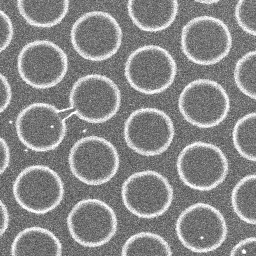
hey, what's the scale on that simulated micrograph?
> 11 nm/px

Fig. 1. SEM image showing a regular array of raised bodies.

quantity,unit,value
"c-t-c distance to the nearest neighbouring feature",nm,680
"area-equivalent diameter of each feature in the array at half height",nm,502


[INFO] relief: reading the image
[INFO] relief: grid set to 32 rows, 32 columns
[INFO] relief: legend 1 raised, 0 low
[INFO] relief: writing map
00111111000000001111110000000011
00011111000000001111110000000011
10001110001111000111100001100011
10000000011111100011000111110001
10000000011111100000000111111000
10001100011111100000000111111000
00011111001111000111100111110000
00111111000000001111100011100011
00111111000000001111110000000011
00011111000000001111110000000011
10001110001111000111100011100011
10000000011111100010000111110001
10000000011111100000000111110000
00001110011111100000000111110000
00011111101111000111100111110001
00111111000000001111100011100011
00111111000000001111100000000111
00011111001110001111100000000111
10001100011111000111100111100011
10000000011111100000000111110001
10000000011111100000001111110000
00011110011111000000000111110000
00111110001110001111000111110001
00111111000000001111100001000011
00111111000000011111100000000111
00011110001110001111100000000111
10000000011111000111000111100011
10000000011111000000001111110001
10000000011111000000001111110000
00111110011111000110001111110000
00111110000100001111100111100011
00111110000000011111100000000111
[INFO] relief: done